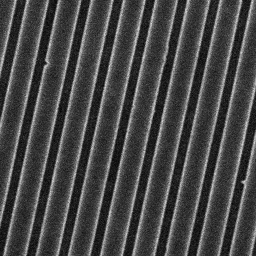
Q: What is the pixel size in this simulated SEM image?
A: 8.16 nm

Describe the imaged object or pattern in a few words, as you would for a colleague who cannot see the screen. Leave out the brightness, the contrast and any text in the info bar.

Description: parallel lines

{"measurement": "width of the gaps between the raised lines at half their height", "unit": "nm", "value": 85.7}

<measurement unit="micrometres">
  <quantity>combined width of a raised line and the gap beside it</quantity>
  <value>0.257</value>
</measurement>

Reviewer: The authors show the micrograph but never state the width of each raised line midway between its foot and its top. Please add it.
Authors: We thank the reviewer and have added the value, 0.172 microns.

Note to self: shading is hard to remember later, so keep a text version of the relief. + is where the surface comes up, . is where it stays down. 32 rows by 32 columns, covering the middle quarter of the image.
+..++++++..++++++..++++++...++++
...+++++...+++++...++++++..+++++
...+++++...+++++...+++++...+++++
...+++++...+++++...+++++...+++++
...+++++..++++++...+++++...+++++
..+++++...++++++..++++++..++++++
..+++++...+++++...+++++...++++++
..+++++...+++++...+++++...+++++.
..+++++...+++++...+++++...+++++.
.++++++..++++++..++++++...+++++.
.+++++...+++++...++++++..++++++.
.+++++...+++++...+++++...+++++..
.+++++...+++++...+++++...+++++..
++++++...+++++...+++++...+++++..
++++++..++++++..++++++...+++++..
+++++...+++++...++++++..++++++..
+++++...+++++...+++++...+++++...
+++++...+++++...+++++...+++++...
+++++..++++++...+++++...+++++...
++++...++++++..++++++..++++++...
++++...+++++...+++++...+++++...+
++++...+++++...+++++...+++++...+
++++...+++++...+++++...+++++...+
++++..++++++..++++++...+++++...+
+++...+++++...++++++..++++++..++
+++...+++++...+++++...+++++...++
+++...+++++...+++++...+++++...++
+++...+++++...+++++...+++++...++
+++..++++++..++++++..++++++...++
++...+++++...+++++...++++++..+++
++...+++++...+++++...+++++...+++
++...+++++...+++++...+++++...+++